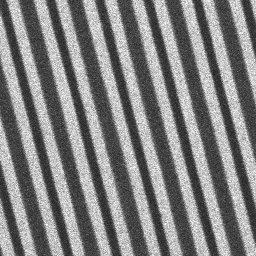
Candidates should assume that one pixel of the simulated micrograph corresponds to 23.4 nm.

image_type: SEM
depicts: parallel lines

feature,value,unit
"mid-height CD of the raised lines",291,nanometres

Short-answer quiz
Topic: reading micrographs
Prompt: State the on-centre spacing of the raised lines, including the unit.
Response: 550 nanometers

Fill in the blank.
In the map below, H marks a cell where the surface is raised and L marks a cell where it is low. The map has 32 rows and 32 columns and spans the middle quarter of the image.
LLHHHLLLLHHHLLHHHLLLLHHHLLHHHLLL
LLHHHLLLLHHHLLLHHHLLLHHHHLLHHHLL
LLHHHHLLLHHHLLLHHHLLLHHHHLLHHHLL
HLLHHHLLLLHHHLLHHHLLLLHHHLLHHHLL
HLLHHHLLLLHHHLLHHHLLLLHHHLLHHHHL
HLLHHHLLLLHHHLLLHHHLLLHHHHLLHHHL
HHLHHHHLLLHHHHLLHHHLLLHHHHLLHHHL
HHLLHHHLLLLHHHLLHHHLLLLHHHLLHHHL
HHLLHHHLLLLHHHLLHHHLLLLHHHLLHHHH
HHLLLHHLLLLHHHLLLHHHLLLLHHHLLHHH
HHLLLHHHLLLHHHHLLHHHLLLLHHHLLHHH
HHHLLHHHLLLLHHHLLHHHLLLLHHHLLHHH
HHHLLHHHLLLLHHHLLHHHHLLLHHHLLHHH
HHHLLLHHHLLLHHHLLLHHHLLLLHHHLLHH
HHHHLLHHHLLLHHHHLLHHHLLLLHHHLLHH
LHHHLLHHHLLLLHHHLLHHHLLLLHHHLLHH
LHHHLLHHHLLLLHHHLLHHHHLLLHHHLLLH
LHHHLLLHHHLLLHHHLLLHHHLLLLHHLLLH
LHHHHLLHHHLLLLHHHLLHHHLLLLHHHLLH
LHHHHLLHHHLLLLHHHLLHHHLLLLHHHLLH
LLHHHLLHHHHLLLHHHLLHHHHLLLHHHLLL
LLHHHLLLHHHLLLLHHLLLHHHLLLLHHHLL
LLHHHHLLHHHLLLLHHHLLHHHLLLLHHHLL
LLHHHHLLHHHLLLLHHHLLHHHLLLLHHHLL
LLLHHHLLHHHHLLLHHHLLLHHHLLLHHHLL
LLLHHHLLLHHHLLLLHHLLLHHHLLLLHHHL
LLLHHHHLLHHHLLLLHHHLLHHHLLLLHHHL
LLLLHHHLLHHHLLLLHHHLLHHHHLLLHHHL
HLLLHHHLLHHHHLLLHHHHLLHHHLLLHHHL
HLLLHHHLLHHHHLLLLHHHLLHHHLLLLHHH
HLLLHHHHLLHHHLLLLHHHLLHHHLLLLHHH
HLLLLHHHLLHHHLLLLHHHLLHHHLLLLHHH